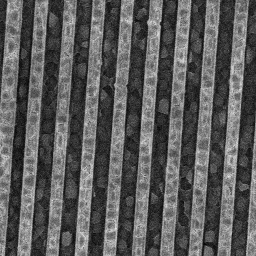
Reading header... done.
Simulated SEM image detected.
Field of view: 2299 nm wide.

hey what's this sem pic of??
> parallel lines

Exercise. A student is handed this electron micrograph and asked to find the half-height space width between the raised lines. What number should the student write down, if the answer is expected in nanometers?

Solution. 148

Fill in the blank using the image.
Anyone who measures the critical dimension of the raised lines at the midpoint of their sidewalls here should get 106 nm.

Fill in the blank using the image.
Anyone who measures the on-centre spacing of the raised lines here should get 255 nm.